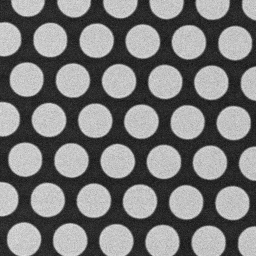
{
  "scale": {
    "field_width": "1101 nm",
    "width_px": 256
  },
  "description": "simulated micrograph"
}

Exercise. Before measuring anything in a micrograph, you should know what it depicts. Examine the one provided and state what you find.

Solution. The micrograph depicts an array of small figures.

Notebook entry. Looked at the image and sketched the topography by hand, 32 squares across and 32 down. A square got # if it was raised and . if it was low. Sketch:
.####..####..####..####.#####.##
..###...###..####..###...###...#
................................
##...###...##....##....##....#..
###.####..####..####..####..###.
###.####..####..####..####.####.
##...###...###..####..###...###.
................................
..###...##....##....##...##....#
.####..####..####..####.####..##
.####..####..####..####.####..##
..###...###..###...###...###..##
................................
##...###...##...###...###...##..
##..####..####..####..###..####.
##..####..####..####.####..####.
##...###..###...###...###..####.
................................
..###...##...###...###...##....#
.####..####..####..###..####..##
.####..####..####.#####.####..##
..###..###...###...###...###..##
................................
##...##...###...###...##....##..
##..####..####.####..####..####.
##..####..####.#####.####..####.
#....##...###...###...###..####.
................................
..##...###...###...###...##....#
.####..####..###..####..####..##
.####..####.#####.####..####..##
..##...###...###...###..####..##